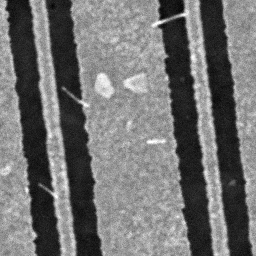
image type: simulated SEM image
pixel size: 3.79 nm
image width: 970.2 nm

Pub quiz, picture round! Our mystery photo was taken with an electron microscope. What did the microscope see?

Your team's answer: lines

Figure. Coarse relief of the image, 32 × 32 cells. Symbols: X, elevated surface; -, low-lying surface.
X---XX---XXXXXXXXXXX---XX---XXXX
X---XX---XXXXXXXXXXX---XX---XXXX
X---XX---XXXXXXXXXXX---XX---XXXX
X---XX---XXXXXXXXXXX---XX---XXXX
X---XX---XXXXXXXXXXX---XX---XXXX
X---XX----XXXXXXXXXX----X----XXX
X----X----XXXXXXXXXXX---XX---XXX
XX---X----XXXXXXXXXXX---XX---XXX
XX---XX---XXXXXXXXXXX---XX---XXX
XX---XX---XXXXXXXXXXX---XX---XXX
XX---XX---XXXXXXXXXXX---XX---XXX
XX---XX---XXXXXXXXXXX---XX---XXX
XX---XX---XXXXXXXXXXX---XX---XXX
XX---XX---XXXXXXXXXXX----X----XX
XX---XX----XXXXXXXXXX----XX---XX
XX----X----XXXXXXXXXXX---XX---XX
XXX---XX---XXXXXXXXXXX---XX---XX
XXX---XX---XXXXXXXXXXX---XX---XX
XXX---XX---XXXXXXXXXXX---XX---XX
XXX---XX---XXXXXXXXXXX---XX---XX
XXX---XX---XXXXXXXXXXX---XX---XX
XXX---XX----XXXXXXXXXX----X----X
XXX----X----XXXXXXXXXX----X----X
XXX----XX---XXXXXXXXXXX---XX---X
XXXX---XX---XXXXXXXXXXX---XX---X
XXXX---XX---XXXXXXXXXXX---XX---X
XXXX---XX---XXXXXXXXXXX---XX---X
XXXX---XX---XXXXXXXXXXX---XX---X
XXXX---XX---XXXXXXXXXXX---XX---X
XXXX---XX---XXXXXXXXXXX----X---X
XXXX----X----XXXXXXXXXXX---X---X
XXXX----X----XXXXXXXXXXX---XX---